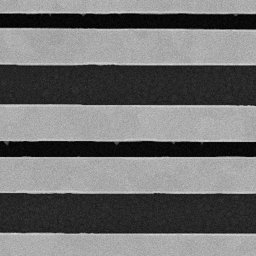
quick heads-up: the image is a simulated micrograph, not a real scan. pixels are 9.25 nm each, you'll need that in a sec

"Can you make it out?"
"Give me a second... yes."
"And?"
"lines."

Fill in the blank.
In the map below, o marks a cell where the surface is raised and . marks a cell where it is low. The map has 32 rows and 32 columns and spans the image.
oooooooooooooooooooooooooooooooo
oooooooooooooooooooooooooooooooo
................................
................................
oooooooooooooooooooooooooooooooo
oooooooooooooooooooooooooooooooo
oooooooooooooooooooooooooooooooo
oooooooooooooooooooooooooooooooo
................................
................................
................................
................................
................................
oooooooooooooooooooooooooooooooo
oooooooooooooooooooooooooooooooo
oooooooooooooooooooooooooooooooo
oooooooooooooooooooooooooooooooo
oooooooooooooooooooooooooooooooo
................................
................................
oooooooooooooooooooooooooooooooo
oooooooooooooooooooooooooooooooo
oooooooooooooooooooooooooooooooo
oooooooooooooooooooooooooooooooo
................................
................................
................................
................................
................................
oooooooooooooooooooooooooooooooo
oooooooooooooooooooooooooooooooo
oooooooooooooooooooooooooooooooo